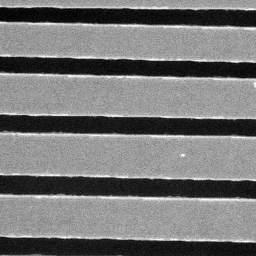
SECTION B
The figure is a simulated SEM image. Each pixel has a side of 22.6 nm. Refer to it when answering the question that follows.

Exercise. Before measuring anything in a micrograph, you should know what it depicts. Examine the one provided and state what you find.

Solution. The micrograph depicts lines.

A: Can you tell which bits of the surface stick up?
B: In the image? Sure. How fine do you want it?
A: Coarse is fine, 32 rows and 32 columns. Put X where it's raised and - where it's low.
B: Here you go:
XXXXXXXXXXXXXXXXXXXXXXXXXXXXXXXX
--------------------------------
--------------------------------
XXXXXXXXXXXXXXXXXXXXXXXXXXXXXXX-
XXXXXXXXXXXXXXXXXXXXXXXXXXXXXXXX
XXXXXXXXXXXXXXXXXXXXXXXXXXXXXXXX
XXXXXXXXXXXXXXXXXXXXXXXXXXXXXXXX
------------------------XXXXXXXX
--------------------------------
XXXXXXXXXXXXXX------------------
XXXXXXXXXXXXXXXXXXXXXXXXXXXXXXXX
XXXXXXXXXXXXXXXXXXXXXXXXXXXXXXXX
XXXXXXXXXXXXXXXXXXXXXXXXXXXXXXXX
XXXXXXXXXXXXXXXXXXXXXXXXXXXXXXXX
-------------XXXXXXXXXXXXXXXXXXX
--------------------------------
--------------------------------
XXXXXXXXXXXXXXXXXXXXXXXXXXXXXXXX
XXXXXXXXXXXXXXXXXXXXXXXXXXXXXXXX
XXXXXXXXXXXXXXXXXXXXXXXXXXXXXXXX
XXXXXXXXXXXXXXXXXXXXXXXXXXXXXXXX
XXXXXXXXXXXXXXXXXXXXXXXXXXXXXXXX
-----------------------------XXX
--------------------------------
XXXX----------------------------
XXXXXXXXXXXXXXXXXXXXXXXXXXXXXXXX
XXXXXXXXXXXXXXXXXXXXXXXXXXXXXXXX
XXXXXXXXXXXXXXXXXXXXXXXXXXXXXXXX
XXXXXXXXXXXXXXXXXXXXXXXXXXXXXXXX
XXXXXXXXXXXXXXXXXXXXXXXXXXXXXXXX
--------------------------------
--------------------------------